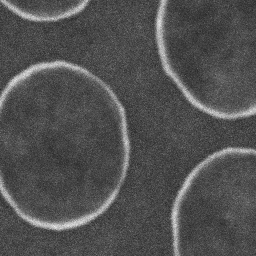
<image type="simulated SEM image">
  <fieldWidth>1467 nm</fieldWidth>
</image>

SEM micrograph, raised bodies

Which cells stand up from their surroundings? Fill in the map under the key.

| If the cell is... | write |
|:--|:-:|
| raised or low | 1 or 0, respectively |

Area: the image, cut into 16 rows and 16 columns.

0111100000111111
0000000000111111
0000000000111111
0000000000111111
0011100000011111
1111111000011111
1111111000001111
1111111100000000
1111111100000000
1111111100000011
1111111100001111
1111111100001111
0111111000011111
0111110000011111
0000000000011111
0000000000011111